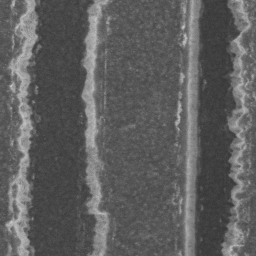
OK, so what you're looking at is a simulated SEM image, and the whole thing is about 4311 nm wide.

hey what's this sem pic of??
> one or a few lines or trenches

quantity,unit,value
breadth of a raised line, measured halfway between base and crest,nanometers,1680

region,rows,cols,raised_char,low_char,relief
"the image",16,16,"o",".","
oo....oooooo...o
oo....oooooo...o
oo....oooooo...o
oo....oooooo...o
o.....oooooo...o
o.....oooooo...o
o.....oooooo...o
oo....oooooo...o
o.....oooooo...o
oo....oooooo...o
o.....oooooo...o
o.....oooooo...o
o.....oooooo...o
o.....oooooo...o
o.....oooooo...o
o.....oooooo..oo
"